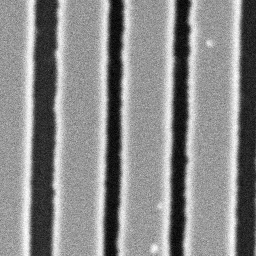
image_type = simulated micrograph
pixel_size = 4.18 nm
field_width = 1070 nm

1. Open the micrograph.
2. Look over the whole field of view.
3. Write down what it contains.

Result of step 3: lines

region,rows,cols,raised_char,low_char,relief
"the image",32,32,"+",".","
++++...+++++++..++++++..++++++..
++++...+++++++..++++++..++++++..
++++...++++++...++++++..++++++..
++++...++++++...++++++..++++++..
++++...++++++..+++++++..++++++..
++++...++++++..+++++++..++++++..
++++...++++++..+++++++..++++++..
++++...++++++..+++++++..++++++..
++++...++++++..+++++++..++++++..
++++...++++++..+++++++..++++++..
++++...++++++..+++++++..++++++..
++++...++++++..+++++++..++++++..
++++...++++++..+++++++..++++++..
++++...++++++..+++++++..++++++..
++++...++++++..+++++++..++++++..
++++...++++++..++++++..+++++++..
++++...++++++..++++++..+++++++..
++++...++++++..++++++..+++++++..
++++...++++++..++++++..+++++++..
++++...++++++..++++++..+++++++..
++++...++++++..++++++..+++++++..
++++...++++++..++++++..+++++++..
++++...++++++..++++++..+++++++..
++++...++++++..++++++..+++++++..
++++...++++++..++++++..++++++...
++++...++++++..++++++..+++++++..
++++...++++++..++++++..++++++...
++++...++++++..++++++..++++++...
++++...++++++..++++++..++++++...
++++...++++++..++++++..++++++...
++++...++++++..++++++..++++++...
++++...++++++..++++++..++++++...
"